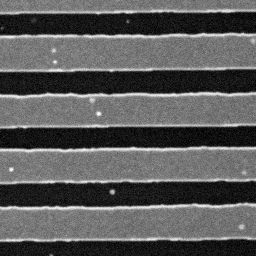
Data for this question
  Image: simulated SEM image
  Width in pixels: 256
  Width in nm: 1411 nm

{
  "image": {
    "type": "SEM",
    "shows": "lines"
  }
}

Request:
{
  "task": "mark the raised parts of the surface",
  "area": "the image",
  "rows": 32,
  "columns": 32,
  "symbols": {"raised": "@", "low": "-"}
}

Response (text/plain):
@@@@@@@@@@@@@@@@@@@@@@@@@@@@@@@@
@@@@@@@@@@@@@@@@@---------------
--------------------------------
--------------------------------
---@@@--@---@@-@@@--@@@@@@@@@@@@
@@@@@@@@@@@@@@@@@@@@@@@@@@@@@@@@
@@@@@@@@@@@@@@@@@@@@@@@@@@@@@@@@
@@@@@@@@@@@@@@@@@@@@@@@@@@@@@@@@
@@@@@@@@@@@@@@@@@@@@@@@@@@@@@@@@
--------------------------------
--------------------------------
--------------------------------
@@@@@@@@@@@@@@@@@@@@@@@@@@@@@@@@
@@@@@@@@@@@@@@@@@@@@@@@@@@@@@@@@
@@@@@@@@@@@@@@@@@@@@@@@@@@@@@@@@
@@@@@@@@@@@@@@@@@@@@@@@@@@@@@@@@
--------------------------------
--------------------------------
-----------------------@@@@@@@@@
@@@@@@@@@@@@@@@@@@@@@@@@@@@@@@@@
@@@@@@@@@@@@@@@@@@@@@@@@@@@@@@@@
@@@@@@@@@@@@@@@@@@@@@@@@@@@@@@@@
@@@@@@@@@@@@@@@@@@@@@@@@@@@@@@@@
--------------------------------
--------------------------------
------------------------------@-
@@@@@@@@@@@@@@@@@@@@@@@@@@@@@@@@
@@@@@@@@@@@@@@@@@@@@@@@@@@@@@@@@
@@@@@@@@@@@@@@@@@@@@@@@@@@@@@@@@
@@@@@@@@@@@@@@@@@@@@@@@@@@@@@@@@
--------------------------------
--------------------------------